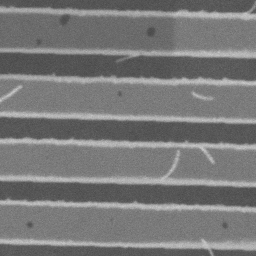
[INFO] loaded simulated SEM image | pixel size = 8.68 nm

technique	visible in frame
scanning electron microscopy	lines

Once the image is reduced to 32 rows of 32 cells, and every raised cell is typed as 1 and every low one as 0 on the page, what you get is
00000000000000000000000000000000
11111111111111100000000000000000
11111111111111111111111111111111
11111111111111111111111111111111
11111111111111111111111111111111
11111111111111111111111111111111
00000011111111111111111111111111
00000000000000000000000000000000
00000000000000000000000000000000
11110000000000000000000000000000
11111111111111111111111111111111
11111111111111111111111111111111
11111111111111111111111111111111
11111111111111111111111111111111
11111111111111111111111111111111
00000000000000000000000000000000
00000000000000000000000000000000
11000000000000000000000000000000
11111111111111111111111111111111
11111111111111111111111111111111
11111111111111111111111111111111
11111111111111111111111111111111
00001111111111111111111111111111
00000000000000000000000000000000
00000000000000000000000000000000
11111111111111100000000000000000
11111111111111111111111111111111
11111111111111111111111111111111
11111111111111111111111111111111
11111111111111111111111111111111
00000111111111111111111111111111
00000000000000000000000000000000